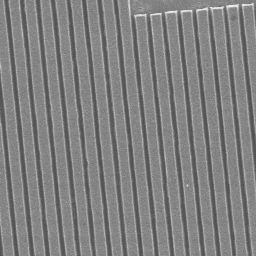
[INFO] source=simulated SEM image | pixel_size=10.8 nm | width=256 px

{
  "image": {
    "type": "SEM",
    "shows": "parallel lines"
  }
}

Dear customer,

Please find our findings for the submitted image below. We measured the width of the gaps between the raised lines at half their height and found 4.35 pixels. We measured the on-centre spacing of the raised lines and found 15.5 px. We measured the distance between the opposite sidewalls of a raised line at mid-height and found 122 nm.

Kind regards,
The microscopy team